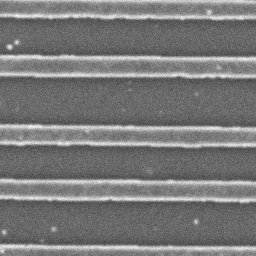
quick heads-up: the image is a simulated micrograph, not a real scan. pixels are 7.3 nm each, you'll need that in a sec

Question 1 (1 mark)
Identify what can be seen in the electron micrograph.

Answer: lines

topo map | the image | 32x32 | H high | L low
HHHHHHHHHHHHHHHHHHHHHHHHHHHHHHHH
HHHHHHHHHHHHHHHHHHHHHHHHHHHHHHHH
LLLLLLLLLLLLLLLLLLLLLLLLLLLLLLLL
LLLLLLLLLLLLLLLLLLLLLLLLLLLLLLLL
LLLLLLLLLLLLLLLLLLLLLLLLLLLLLLLL
LLLLLLLLLLLLLLLLLLLLLLLLLLLLLLLL
LLLLLLLLLLLLLLLLLLLLLLLLLLLLLLLL
HHHHHHHHHHHHHHHHHHHHHHHHHHHHHHHH
HHHHHHHHHHHHHHHHHHHHHHHHHHHHHHHH
LLLLHHHHHHHHHHHHHHHHHHHHHHHHHHHH
LLLLLLLLLLLLLLLLLLLLLLLLLLLLLLLL
LLLLLLLLLLLLLLLLLLLLLLLLLLLLLLLL
LLLLLLLLLLLLLLLLLLLLLLLLLLLLLLLL
LLLLLLLLLLLLLLLLLLLLLLLLLLLLLLLL
LLLLLLLLLLLLLLLLLLLLLLLLLLLLLLLL
LLLLLLLLLLLLLLLLLLLLLLLLLLLLLLLL
HHHHHHHHHHHHHHHHHHHHHHHHHHHHHHHH
HHHHHHHHHHHHHHHHHHHHHHHHHHHHHHHH
LLLLLLLLLLLLLLLLLLLLLLLLLLLLLLLL
LLLLLLLLLLLLLLLLLLLLLLLLLLLLLLLL
LLLLLLLLLLLLLLLLLLLLLLLLLLLLLLLL
LLLLLLLLLLLLLLLLLLLLLLLLLLLLLLLL
HHLLLLLLLLLLLLLLLLLLLLLLLLLLLLLL
HHHHHHHHHHHHHHHHHHHHHHHHHHHHHHHH
HHHHHHHHHHHHHHHHHHHHHHHHHHHHHHHH
LLLLLLLLLLLLLLLLLLLLLLLLLLLLLLLL
LLLLLLLLLLLLLLLLLLLLLLLLLLLLLLLL
LLLLLLLLLLLLLLLLLLLLLLLLLLLLLLLL
LLLLLLLLLLLLLLLLLLLLLLLLLLLLLLLL
LLLLLLLLLLLLLLLLLLLLLLLLLLLLLLLL
LLLLLLLLLLLLLLLLLLLLLLLLLLLLLLLL
HHHHHHHHHHHHHHHHHHHHHHHHHHHHHHHH